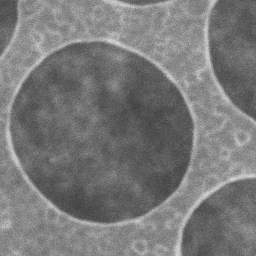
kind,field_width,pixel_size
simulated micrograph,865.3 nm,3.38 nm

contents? holes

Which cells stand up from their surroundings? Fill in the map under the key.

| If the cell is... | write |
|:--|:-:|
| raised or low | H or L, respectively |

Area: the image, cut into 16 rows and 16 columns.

LHHHHHHHHHHHHLLL
LHHHHHHHHHHHHLLL
LHHHHHHHHHHHHLLL
HHHLLLLLLHHHHLLL
HHLLLLLLLLHHHLLL
HLLLLLLLLLLHHHLL
HLLLLLLLLLLLHHHL
HLLLLLLLLLLLHHHH
HLLLLLLLLLLLHHHH
HLLLLLLLLLLLHHHH
HLLLLLLLLLLLHHHH
HHLLLLLLLLLHHHLL
HHHLLLLLLLHHHLLL
HHHHLLLLLHHHLLLL
HHHHHHHHHHHLLLLL
HHHHHHHHHHHLLLLL